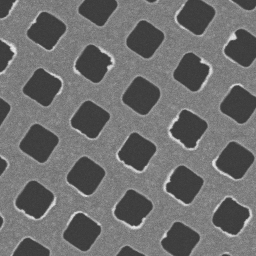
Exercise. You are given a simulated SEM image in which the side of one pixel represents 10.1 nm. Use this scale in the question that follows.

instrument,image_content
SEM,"a regular array of holes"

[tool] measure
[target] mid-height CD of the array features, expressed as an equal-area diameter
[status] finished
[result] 346 nm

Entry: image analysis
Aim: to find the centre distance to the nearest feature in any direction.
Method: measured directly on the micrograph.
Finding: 569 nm